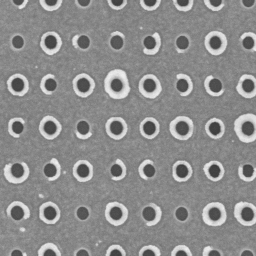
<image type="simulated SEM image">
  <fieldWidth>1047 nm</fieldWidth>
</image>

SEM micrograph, a regular array of holes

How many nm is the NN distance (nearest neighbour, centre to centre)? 134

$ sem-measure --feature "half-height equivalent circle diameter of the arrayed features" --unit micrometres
0.0534